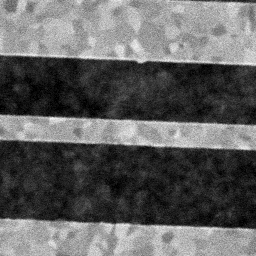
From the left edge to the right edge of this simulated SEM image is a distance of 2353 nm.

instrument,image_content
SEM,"one or a few lines or trenches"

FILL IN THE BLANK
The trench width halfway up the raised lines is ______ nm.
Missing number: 632